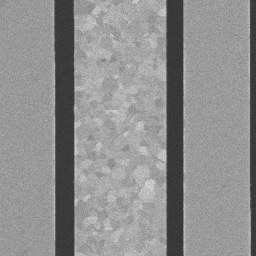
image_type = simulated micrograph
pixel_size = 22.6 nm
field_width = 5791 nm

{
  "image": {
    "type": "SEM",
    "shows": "lines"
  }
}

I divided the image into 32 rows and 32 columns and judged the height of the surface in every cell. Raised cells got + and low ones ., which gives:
+++++++..++++++++++++..++++++++.
+++++++..++++++++++++..++++++++.
+++++++..++++++++++++..++++++++.
+++++++..++++++++++++..++++++++.
+++++++..++++++++++++..++++++++.
+++++++..++++++++++++..++++++++.
+++++++..++++++++++++..++++++++.
+++++++..++++++++++++..++++++++.
+++++++..++++++++++++..++++++++.
+++++++..++++++++++++..++++++++.
+++++++..++++++++++++..++++++++.
+++++++..++++++++++++..++++++++.
+++++++..++++++++++++..++++++++.
+++++++..++++++++++++..++++++++.
+++++++..++++++++++++..++++++++.
+++++++..++++++++++++..++++++++.
+++++++..++++++++++++..++++++++.
+++++++..++++++++++++..++++++++.
+++++++..++++++++++++..++++++++.
+++++++..++++++++++++..++++++++.
+++++++..++++++++++++..++++++++.
+++++++..++++++++++++..++++++++.
+++++++..++++++++++++..++++++++.
+++++++..++++++++++++..++++++++.
+++++++..++++++++++++..++++++++.
+++++++..++++++++++++..++++++++.
+++++++..++++++++++++..++++++++.
+++++++..++++++++++++..++++++++.
+++++++..++++++++++++..++++++++.
+++++++..++++++++++++..++++++++.
+++++++..++++++++++++..++++++++.
+++++++..++++++++++++..++++++++.